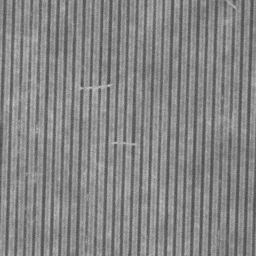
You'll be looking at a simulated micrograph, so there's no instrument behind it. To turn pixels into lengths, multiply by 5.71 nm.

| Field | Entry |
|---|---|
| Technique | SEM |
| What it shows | parallel lines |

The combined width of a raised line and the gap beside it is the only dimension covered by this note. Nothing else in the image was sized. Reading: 50.2 nm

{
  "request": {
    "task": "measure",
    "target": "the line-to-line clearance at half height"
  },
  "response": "0.0257 µm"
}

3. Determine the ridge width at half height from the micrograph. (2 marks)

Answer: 4.5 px